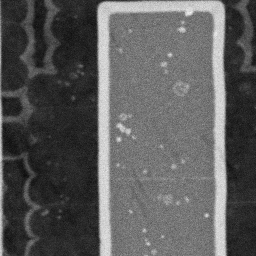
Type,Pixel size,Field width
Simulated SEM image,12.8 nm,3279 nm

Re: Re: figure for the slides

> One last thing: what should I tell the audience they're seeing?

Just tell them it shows wiring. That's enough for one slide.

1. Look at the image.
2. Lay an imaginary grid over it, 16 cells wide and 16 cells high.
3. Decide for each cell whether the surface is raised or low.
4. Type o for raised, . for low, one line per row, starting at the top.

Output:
.......ooooooo..
......oooooooo..
......oooooooo..
......oooooooo..
......oooooooo..
......oooooooo..
......oooooooo..
......oooooooo..
......oooooooo..
......oooooooo..
......oooooooo..
......oooooooo..
......oooooooo..
......oooooooo..
......oooooooo..
.......ooooooo..